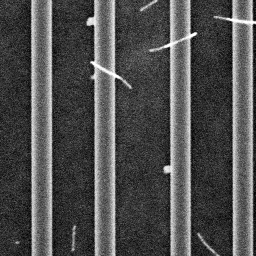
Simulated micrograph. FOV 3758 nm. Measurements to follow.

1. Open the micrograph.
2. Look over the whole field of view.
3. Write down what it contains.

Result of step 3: groups of lines, slits or small figures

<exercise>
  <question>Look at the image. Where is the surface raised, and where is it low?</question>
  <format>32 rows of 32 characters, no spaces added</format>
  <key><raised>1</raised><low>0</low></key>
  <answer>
00001100000011000000011100000111
00001100000011000000011100000111
00001100000011000000011100000111
00001100000011000000011100000111
00001100000011000000011100000111
00001100000011000000011100000111
00001100000011000000011100000111
00001100000011000000011100000111
00001100000011000000011100000111
00001100000011000000011100000111
00001100000011000000011100000111
00001100000011000000011100000111
00001100000011000000011100000111
00001100000011000000011100000111
00001100000011000000011100000111
00001100000011000000011100000111
00001100000011000000011100000111
00001100000011000000011100000111
00001100000011000000011100000111
00001100000011000000011100000111
00001100000011000000011100000111
00001100000011000000011100000111
00001100000011000000011100000111
00001100000011000000011100000111
00001100000011000000011100000111
00001100000011000000011100000111
00001100000011000000011100000111
00001100000011000000011100000111
00001100000011000000011100000111
00001100000011000000011100000111
00001100000011000000011100000111
00001100000011000000011100000111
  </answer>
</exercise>